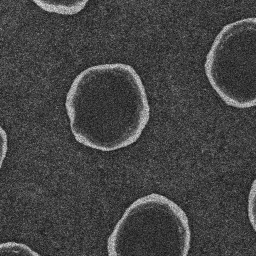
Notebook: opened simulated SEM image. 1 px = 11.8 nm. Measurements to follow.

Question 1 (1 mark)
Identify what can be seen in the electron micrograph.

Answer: raised bodies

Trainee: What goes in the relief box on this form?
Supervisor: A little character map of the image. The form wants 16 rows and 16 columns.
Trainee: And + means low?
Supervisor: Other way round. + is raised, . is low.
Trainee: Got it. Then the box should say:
...++...........
...............+
..............++
.............+++
.....+++.....+++
.....++++....+++
....+++++......+
....+++++.......
.....+++........
................
................
................
.........+......
........+++.....
.......+++++....
++.....+++++....